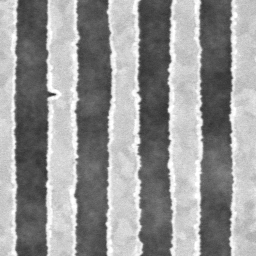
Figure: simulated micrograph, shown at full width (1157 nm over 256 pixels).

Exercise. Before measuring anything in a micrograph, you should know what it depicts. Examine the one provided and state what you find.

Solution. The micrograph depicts one or a few lines or trenches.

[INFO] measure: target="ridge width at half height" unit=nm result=126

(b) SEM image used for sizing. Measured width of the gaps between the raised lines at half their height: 149 nanometers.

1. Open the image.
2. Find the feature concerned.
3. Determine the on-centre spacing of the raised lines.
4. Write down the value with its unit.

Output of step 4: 279 nanometers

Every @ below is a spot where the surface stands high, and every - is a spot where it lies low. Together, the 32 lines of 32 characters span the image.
@@----@@@@----@@@-----@@@----@@@
@@----@@@----@@@@----@@@@----@@@
@@----@@@@----@@@----@@@@----@@@
@@----@@@@----@@@----@@@@----@@@
@@----@@@@----@@@----@@@@----@@@
@@----@@@-----@@@----@@@@----@@@
@@----@@@-----@@@----@@@@----@@@
@@----@@@@----@@@-----@@@----@@@
@@----@@@@----@@@----@@@@----@@@
@@----@@@@----@@@----@@@@----@@@
@@----@@@-----@@@----@@@@----@@@
@@----@@@-----@@@----@@@@----@@@
@@----@@@@----@@@----@@@@----@@@
@@----@@@-----@@@----@@@@----@@@
@@----@@@-----@@@----@@@@----@@@
@@----@@@-----@@@----@@@@----@@@
@@----@@@-----@@@----@@@@----@@@
@@----@@@-----@@@----@@@@----@@@
@@----@@@-----@@@----@@@@----@@@
@@----@@@@----@@@----@@@@----@@@
@@----@@@-----@@@----@@@@----@@@
@@----@@@-----@@@----@@@@----@@@
@@----@@@-----@@@----@@@@----@@@
@@----@@@-----@@@----@@@@----@@@
@@----@@@-----@@@-----@@@----@@@
@@----@@@-----@@@-----@@@----@@@
@@----@@@-----@@@-----@@@----@@@
@@----@@@-----@@@-----@@@----@@@
@@----@@@-----@@@-----@@@----@@@
@@----@@@----@@@@-----@@@----@@@
@@----@@@----@@@@@----@@@----@@@
@@----@@@-----@@@@---@@@@----@@@